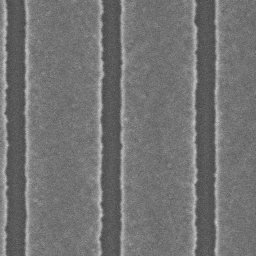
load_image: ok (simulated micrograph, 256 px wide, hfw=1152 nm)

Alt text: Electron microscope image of lines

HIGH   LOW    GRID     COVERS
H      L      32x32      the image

HLLHHHHHHHHHHLLHHHHHHHHHLLLHHHHH
HLLHHHHHHHHHHLLHHHHHHHHHLLLHHHHH
HLLHHHHHHHHHHLLHHHHHHHHHLLLHHHHH
HLLHHHHHHHHHHLLHHHHHHHHHHLLHHHHH
HLLHHHHHHHHHHLLHHHHHHHHHLLLHHHHH
HLLHHHHHHHHHHLLHHHHHHHHHHLLHHHHH
HLLHHHHHHHHHHLLHHHHHHHHHLLLHHHHH
HLLHHHHHHHHHHLLHHHHHHHHHLLLHHHHH
HLLHHHHHHHHHHLLHHHHHHHHHLLLHHHHH
HLLHHHHHHHHHHLLHHHHHHHHHHLLHHHHH
HLLHHHHHHHHHHLLHHHHHHHHHHLLHHHHH
HLLHHHHHHHHHHLLHHHHHHHHHLLLHHHHH
HLLHHHHHHHHHHLLHHHHHHHHHLLLHHHHH
HLLHHHHHHHHHHLLHHHHHHHHHLLLHHHHH
HLLHHHHHHHHHHLLHHHHHHHHHLLLHHHHH
HLLHHHHHHHHHHLLHHHHHHHHHLLLHHHHH
HLLHHHHHHHHHHLLHHHHHHHHHLLLHHHHH
HLLHHHHHHHHHHLLHHHHHHHHHLLLHHHHH
HLLHHHHHHHHHHLLHHHHHHHHHLLLHHHHH
HLLHHHHHHHHHHLLHHHHHHHHHLLLHHHHH
HLLHHHHHHHHHHLLHHHHHHHHHLLLHHHHH
HLLHHHHHHHHHHLLHHHHHHHHHHLLHHHHH
HLLHHHHHHHHHHLLHHHHHHHHHLLLHHHHH
HLLHHHHHHHHHHLLHHHHHHHHHLLLHHHHH
HLLHHHHHHHHHHLLHHHHHHHHHLLLHHHHH
HLLHHHHHHHHHHLLHHHHHHHHHLLLHHHHH
HLLHHHHHHHHHHLLHHHHHHHHHLLLHHHHH
HLLHHHHHHHHHHLLHHHHHHHHHLLLHHHHH
HLLHHHHHHHHHHLLHHHHHHHHHLLLHHHHH
HLLHHHHHHHHHHLLHHHHHHHHHHLLHHHHH
HLLHHHHHHHHHHLLHHHHHHHHHLLLHHHHH
HLLHHHHHHHHHHLLHHHHHHHHHLLLHHHHH